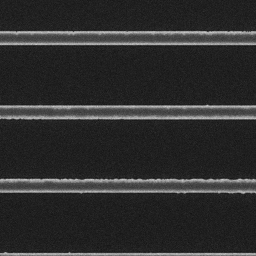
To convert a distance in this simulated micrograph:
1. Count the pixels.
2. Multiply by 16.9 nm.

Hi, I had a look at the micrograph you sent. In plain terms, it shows lines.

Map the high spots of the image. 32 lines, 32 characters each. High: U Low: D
DDDDDDDDDDDDDDDDDDDDDDDDDDDDDDDD
DDDDDDDDDDDDDDDDDDDDDDDDDDDDDDDD
DDDDDDDDDDDDDDDDDDDDDDDDDDDDDDDD
DDDDDDDDDDDDDDDDDDDDDDDDDDDDDDDD
UUUUUUUUUUUUUUUUUUUUUUUUUUUUUUUU
UUUUUUUUUUUUUUUUUUUUUUUUUUUUUUUU
DDDDDDDDDDDDDDDDDDDDDDDDDDDDDDDD
DDDDDDDDDDDDDDDDDDDDDDDDDDDDDDDD
DDDDDDDDDDDDDDDDDDDDDDDDDDDDDDDD
DDDDDDDDDDDDDDDDDDDDDDDDDDDDDDDD
DDDDDDDDDDDDDDDDDDDDDDDDDDDDDDDD
DDDDDDDDDDDDDDDDDDDDDDDDDDDDDDDD
DDDDDDDDDDDDDDDDDDDDDDDDDDDDDDDD
UUUUUUUUUUUUUUUUUUUUUUUUUUUUUUUU
UUUUUUUUUUUUUUUUUUUUUUUUUUUUUUUU
DDDDDDDDDDDDDDDDDDDDDDDDDDDDDDDD
DDDDDDDDDDDDDDDDDDDDDDDDDDDDDDDD
DDDDDDDDDDDDDDDDDDDDDDDDDDDDDDDD
DDDDDDDDDDDDDDDDDDDDDDDDDDDDDDDD
DDDDDDDDDDDDDDDDDDDDDDDDDDDDDDDD
DDDDDDDDDDDDDDDDDDDDDDDDDDDDDDDD
DDDDDDDDDDDDDDDDDDDDDDDDDDDDDDDD
UUUUUUUUUUUUUUDUUUUUUUUDUUUUDUDU
UUUUUUUUUUUUUUUUUUUUUUUUUUUUUUUU
DDDDDDDDDDDDDDDDDDDDDDDDDDDDDDDD
DDDDDDDDDDDDDDDDDDDDDDDDDDDDDDDD
DDDDDDDDDDDDDDDDDDDDDDDDDDDDDDDD
DDDDDDDDDDDDDDDDDDDDDDDDDDDDDDDD
DDDDDDDDDDDDDDDDDDDDDDDDDDDDDDDD
DDDDDDDDDDDDDDDDDDDDDDDDDDDDDDDD
DDDDDDDDDDDDDDDDDDDDDDDDDDDDDDDD
DDDDDDDDDDDDDDDDDDDDDDDDDDDDDDDD